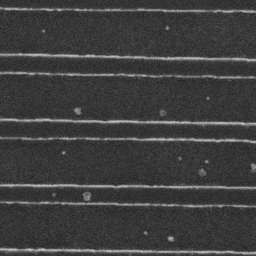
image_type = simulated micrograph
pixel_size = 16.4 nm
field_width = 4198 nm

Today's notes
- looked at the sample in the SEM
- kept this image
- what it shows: lines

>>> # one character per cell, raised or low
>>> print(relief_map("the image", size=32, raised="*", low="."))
********************************
................................
................................
................................
................................
................................
................................
********************************
********************************
..................**..**********
................................
................................
................................
................................
................................
********************************
********************************
........................********
................................
................................
................................
................................
................................
********************************
********************************
..............******************
................................
................................
................................
................................
................................
******************************..